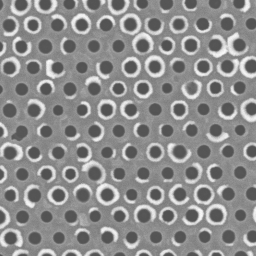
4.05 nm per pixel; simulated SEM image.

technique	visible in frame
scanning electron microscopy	a regular array of holes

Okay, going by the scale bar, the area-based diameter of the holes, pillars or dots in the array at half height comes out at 49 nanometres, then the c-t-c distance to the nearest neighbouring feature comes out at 0.0976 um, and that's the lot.